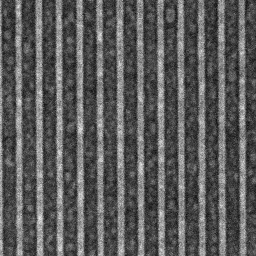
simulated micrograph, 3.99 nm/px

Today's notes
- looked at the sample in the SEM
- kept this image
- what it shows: parallel lines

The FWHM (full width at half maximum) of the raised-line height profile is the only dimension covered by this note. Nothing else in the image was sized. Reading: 4.76 px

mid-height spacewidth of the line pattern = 60.4 nm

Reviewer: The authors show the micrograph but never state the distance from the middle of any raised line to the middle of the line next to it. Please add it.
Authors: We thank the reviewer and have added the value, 80.9 nm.